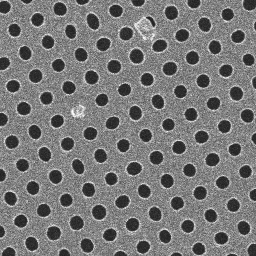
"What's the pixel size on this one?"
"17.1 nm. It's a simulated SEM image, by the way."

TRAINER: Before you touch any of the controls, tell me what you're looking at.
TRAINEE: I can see a regular array of holes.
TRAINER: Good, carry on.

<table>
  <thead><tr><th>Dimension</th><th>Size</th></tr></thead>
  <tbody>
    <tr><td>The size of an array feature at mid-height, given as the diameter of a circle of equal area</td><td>227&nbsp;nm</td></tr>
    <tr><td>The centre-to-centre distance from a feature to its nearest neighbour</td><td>424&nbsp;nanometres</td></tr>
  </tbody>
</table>